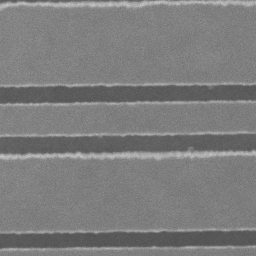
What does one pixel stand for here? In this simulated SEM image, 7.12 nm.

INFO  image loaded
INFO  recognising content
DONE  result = lines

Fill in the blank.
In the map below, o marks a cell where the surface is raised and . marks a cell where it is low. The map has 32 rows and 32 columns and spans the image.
oooooooooooooooooooooooooooooooo
oooooooooooooooooooooooooooooooo
oooooooooooooooooooooooooooooooo
oooooooooooooooooooooooooooooooo
oooooooooooooooooooooooooooooooo
oooooooooooooooooooooooooooooooo
oooooooooooooooooooooooooooooooo
oooooooooooooooooooooooooooooooo
oooooooooooooooooooooooooooooooo
oooooooooooooooooooooooooooooooo
oooooooooooooooooooooooooooooooo
................................
................................
oooooooooooooooooooooooooooooooo
oooooooooooooooooooooooooooooooo
oooooooooooooooooooooooooooooooo
oooooooooooooooooooooooooooooooo
................................
................................
oooooooooooooooooooooooooooooooo
oooooooooooooooooooooooooooooooo
oooooooooooooooooooooooooooooooo
oooooooooooooooooooooooooooooooo
oooooooooooooooooooooooooooooooo
oooooooooooooooooooooooooooooooo
oooooooooooooooooooooooooooooooo
oooooooooooooooooooooooooooooooo
oooooooooooooooooooooooooooooooo
oooooooooooooooooooooooooooooooo
................................
................................
oooooooooooooooooooooooooooooooo